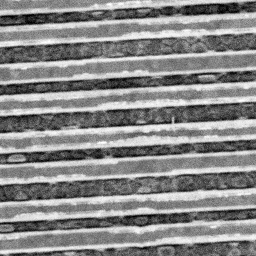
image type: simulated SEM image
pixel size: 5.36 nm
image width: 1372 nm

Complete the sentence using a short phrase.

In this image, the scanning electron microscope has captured parallel lines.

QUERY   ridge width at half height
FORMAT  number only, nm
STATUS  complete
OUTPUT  90.2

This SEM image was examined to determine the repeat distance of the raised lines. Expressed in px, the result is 34.4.